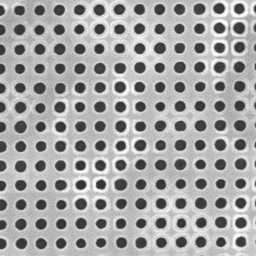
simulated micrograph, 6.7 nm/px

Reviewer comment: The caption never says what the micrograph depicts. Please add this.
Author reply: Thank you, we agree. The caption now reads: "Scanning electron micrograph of a regular array of holes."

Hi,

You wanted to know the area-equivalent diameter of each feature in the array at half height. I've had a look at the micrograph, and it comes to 0.0745 µm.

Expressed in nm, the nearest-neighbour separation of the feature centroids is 129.